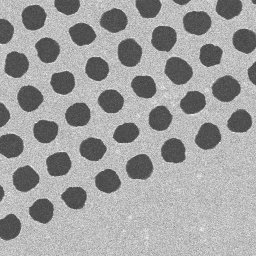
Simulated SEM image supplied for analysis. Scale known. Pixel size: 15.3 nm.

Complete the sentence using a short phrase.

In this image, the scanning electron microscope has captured a regular array of holes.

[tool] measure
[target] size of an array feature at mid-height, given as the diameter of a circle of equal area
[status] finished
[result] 0.376 micrometres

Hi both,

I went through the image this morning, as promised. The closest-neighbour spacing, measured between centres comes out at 538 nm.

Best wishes